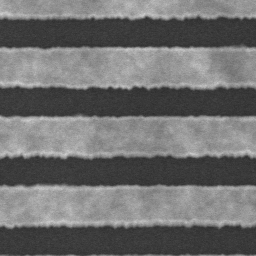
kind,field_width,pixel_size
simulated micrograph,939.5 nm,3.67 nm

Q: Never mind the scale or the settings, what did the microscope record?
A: lines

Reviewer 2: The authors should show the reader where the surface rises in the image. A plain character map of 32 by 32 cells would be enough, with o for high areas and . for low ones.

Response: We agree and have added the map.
oooooooooooooooooooooooooooooooo
oooooooooooooooooooooooooooooooo
......................o.........
................................
................................
................................
oooooooooooooooooooooooooooooooo
oooooooooooooooooooooooooooooooo
oooooooooooooooooooooooooooooooo
oooooooooooooooooooooooooooooooo
oooooooooooooooooooooooooooooooo
................................
................................
................................
.....o...........o.....o.o.o...o
oooooooooooooooooooooooooooooooo
oooooooooooooooooooooooooooooooo
oooooooooooooooooooooooooooooooo
oooooooooooooooooooooooooooooooo
oooooooooooooooooooooooooooooo.o
................................
................................
................................
oooooooooooooooooooooooooooooooo
oooooooooooooooooooooooooooooooo
oooooooooooooooooooooooooooooooo
oooooooooooooooooooooooooooooooo
oooooooooooooooooooooooooooooooo
................................
................................
................................
................................